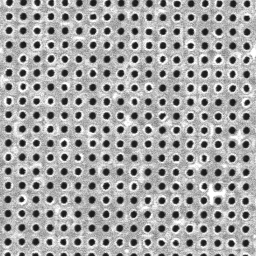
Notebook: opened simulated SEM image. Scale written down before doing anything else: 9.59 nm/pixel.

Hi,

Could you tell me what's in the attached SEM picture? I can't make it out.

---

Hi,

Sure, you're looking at a regular array of holes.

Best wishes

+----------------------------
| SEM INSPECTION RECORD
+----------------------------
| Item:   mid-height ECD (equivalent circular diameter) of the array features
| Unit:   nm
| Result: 70.2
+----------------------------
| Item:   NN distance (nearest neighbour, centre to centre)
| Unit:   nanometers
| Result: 132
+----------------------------